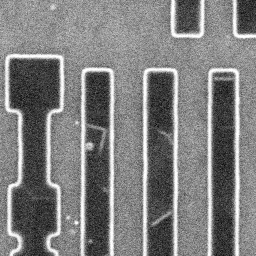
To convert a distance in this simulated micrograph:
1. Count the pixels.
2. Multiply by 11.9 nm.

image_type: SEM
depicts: wiring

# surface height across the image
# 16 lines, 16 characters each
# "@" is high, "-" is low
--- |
-----------@@--@
-----------@@--@
----------------
----------------
@@@@-@@--@@--@@-
@@@@-@@--@@--@@-
@@@@-@@--@@--@@-
-@@--@@--@@--@@-
-@@--@@--@@--@@-
-@@--@@--@@--@@-
-@@--@@--@@--@@-
-@@--@@--@@--@@-
-@@@-@@--@@--@@-
-@@@-@@--@@--@@-
-@@--@@--@@--@@-
-@@--@@--@@--@@-